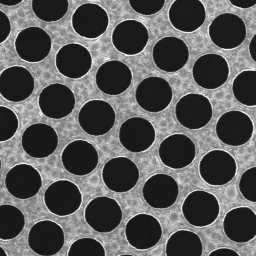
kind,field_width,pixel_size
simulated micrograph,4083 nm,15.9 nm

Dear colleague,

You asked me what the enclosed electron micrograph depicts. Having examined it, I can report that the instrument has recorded a regular array of holes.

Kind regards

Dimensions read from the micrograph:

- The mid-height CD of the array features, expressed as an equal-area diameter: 572 nm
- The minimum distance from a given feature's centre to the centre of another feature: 691 nanometres